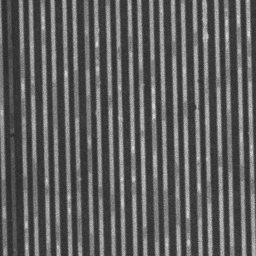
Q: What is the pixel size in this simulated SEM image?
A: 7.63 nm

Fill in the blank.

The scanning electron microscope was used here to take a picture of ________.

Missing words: parallel lines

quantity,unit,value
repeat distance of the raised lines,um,0.0827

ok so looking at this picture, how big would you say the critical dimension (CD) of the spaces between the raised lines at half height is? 55.3 nm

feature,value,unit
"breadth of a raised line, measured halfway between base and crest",21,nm